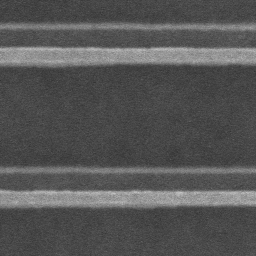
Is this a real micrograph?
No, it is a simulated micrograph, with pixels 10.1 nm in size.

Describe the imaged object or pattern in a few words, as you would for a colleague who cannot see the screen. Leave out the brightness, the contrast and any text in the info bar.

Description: lines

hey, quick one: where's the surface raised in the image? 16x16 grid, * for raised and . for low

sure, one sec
................
................
****************
****************
................
................
................
................
................
................
................
****************
****************
................
................
................